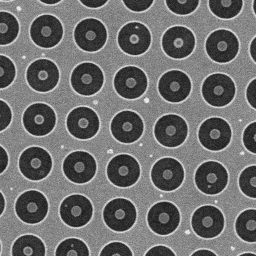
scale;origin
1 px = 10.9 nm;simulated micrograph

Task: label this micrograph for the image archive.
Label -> an array of small figures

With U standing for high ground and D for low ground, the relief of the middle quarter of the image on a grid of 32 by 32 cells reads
UUUDDDDDDUUUUUUUDUUUUUUUUUUUUUUU
UUDDDDDDDUUUUUDDDDDUUUUUUUUDDUUU
UUDDDDDDDDUUUDDDDDDDUUUUUDDDDDUU
UUDDDUUDDDUUDDDDDDDDDUUUDDDDDDDU
UUDDDUDDDDUUDDDDUUDDDUUUDDDDDDDD
UUDDDDDDDDUUDDDDUDDDDUUDDDDUUDDD
UUDDDDDDDUUUUDDDDDDDDUUUDDDUDDDD
UUUDDDDDUUUUUUDDDDDDUUUUDDDDDDDU
UUUUUUUUUUUUUUUDDDUUUUUUUDDDDDDU
UUUUUUUUUUUUUUUUUUUUUUUUUUUDDUUU
UUUUDUUUUUUUUUUUUUUUUUUUUUUUUUUU
UUDDDDDUUUUUUUUUUUUUUUUUUUUUUUUU
UDDDDDDDUUUUUDDDDDDUUUUUUUDUUUUU
UDDDDDDDDUUUDDDDDDDUUUUUDDDDDDUU
DDDDUUDDDUUUDDDDDDDDUUUDDDDDDDUU
UDDDUUDDDUUUDDDUUDDDUUUDDDDDDDDU
UDDDDDDDDUUUDDDUDDDDUUDDDDUUDDDU
UUDDDDDDUUUUDDDDDDDDUUDDDDUDDDDU
UUUDDDDUUUUUUDDDDDDUUUUDDDDDDDDU
UUUUUUUUUUUUUUDDDDUUUUUUDDDDDDUU
UUUUUUUUUUUUUUUUUUUUUUUUUDDDDUUU
UUUUUUUUUUUUUUUUUUUUUUUUUUUUUUUU
UDDDDDDUUUUUUUDUUUUUUUUUUUUUUUUU
DDDDDDDDUUUUDDDDDDUUUUUUDDDUUUUU
DDDDDDDDUUUDDDDDDDUUUUUDDDDDDUUU
DDDUUDDDUUUDDDDDDDDUUUDDDDDDDDUU
DDDUUDDDUUUDDDUUDDDUUUDDDDDDDDUU
DDDDDDDDUUUDDDUUDDDUUUDDDUUDDDUU
UDDDDDDUUUUDDDDDDDDUUUDDDUDDDDUU
UUDDDDUUUUUUDDDDDDUUUUDDDDDDDDUU
UUUUUUUUUUUUUDDDDUUUUUUDDDDDDUUU
UUUUUUUUUUUUUUUUUUUUUUUUDDDDUUUU